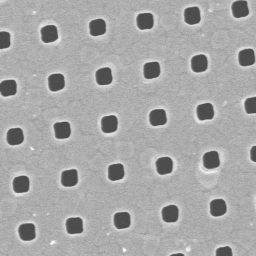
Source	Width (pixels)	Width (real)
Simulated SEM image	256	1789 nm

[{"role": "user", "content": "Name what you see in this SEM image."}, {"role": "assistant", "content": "a regular array of holes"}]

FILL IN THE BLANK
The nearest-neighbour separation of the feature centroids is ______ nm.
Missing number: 334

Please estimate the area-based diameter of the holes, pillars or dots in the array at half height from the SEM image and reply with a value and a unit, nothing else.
125 nanometers